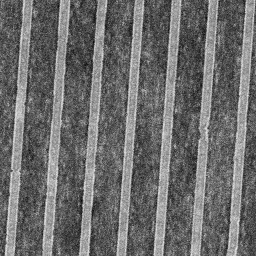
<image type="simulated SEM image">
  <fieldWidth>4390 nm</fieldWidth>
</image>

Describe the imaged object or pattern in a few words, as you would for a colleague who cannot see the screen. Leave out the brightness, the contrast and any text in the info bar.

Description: parallel lines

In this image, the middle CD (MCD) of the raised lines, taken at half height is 8.73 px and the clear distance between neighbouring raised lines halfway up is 498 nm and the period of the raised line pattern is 634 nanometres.